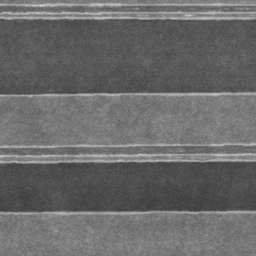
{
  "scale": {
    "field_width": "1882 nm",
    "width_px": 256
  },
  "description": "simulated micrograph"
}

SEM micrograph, lines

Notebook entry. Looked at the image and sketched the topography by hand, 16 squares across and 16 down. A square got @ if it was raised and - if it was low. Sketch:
@@@@@@@@@@@@@@@@
----------------
----------------
----------------
----------------
----------------
@@@@@@@@@@@@@@@@
@@@@@@@@@@@@@@@@
@@@@@@@@@@@@@@@@
@@@@@@@@@@@@@@@@
----------------
----------------
----------------
@@@@@@@@@@@@@@@@
@@@@@@@@@@@@@@@@
@@@@@@@@@@@@@@@@